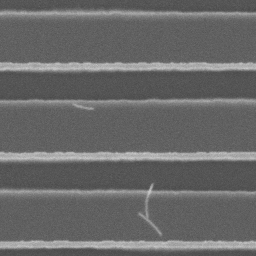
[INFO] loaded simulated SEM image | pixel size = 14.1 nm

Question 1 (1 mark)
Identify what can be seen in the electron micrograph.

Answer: lines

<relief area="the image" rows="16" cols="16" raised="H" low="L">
LLLLLLLLLLLLLLLL
HHHHHHHHHHHHHHHH
HHHHHHHHHHHHHHHH
HHHHHHHHHHHHHHHH
LLLLLLLLLLLLLLLL
LLLLLLLLLLLLLLLL
HHHHHHHHHHHHHHHH
HHHHHHHHHHHHHHHH
HHHHHHHHHHHHHHHH
HHHHHHHHHHHHHHHH
LLLLLLLLLLLLLLLL
LLLLLLLLLLLLLLLL
HHHHHHHHHHHHHHHH
HHHHHHHHHHHHHHHH
HHHHHHHHHHHHHHHH
LLLLLLLLLLHHLLLL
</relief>